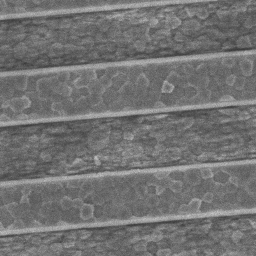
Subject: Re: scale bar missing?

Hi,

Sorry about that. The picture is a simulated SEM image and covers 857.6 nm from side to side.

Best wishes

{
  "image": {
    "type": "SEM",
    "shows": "one or a few lines or trenches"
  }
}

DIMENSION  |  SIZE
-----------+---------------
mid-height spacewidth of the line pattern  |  193 nanometres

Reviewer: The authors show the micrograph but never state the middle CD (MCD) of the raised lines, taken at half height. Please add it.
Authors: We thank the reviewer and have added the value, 50.8 pixels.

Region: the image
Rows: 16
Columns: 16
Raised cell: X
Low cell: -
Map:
XXXXXXX---------
----------------
----------------
------------XXXX
-XXXXXXXXXXXXXXX
XXXXXXXXXXXXXXXX
XXXXXXXXXXXXXXX-
XXXX------------
----------------
----------------
-----------XXXXX
XXXXXXXXXXXXXXXX
XXXXXXXXXXXXXXXX
XXXXXXXXXXXXX---
X---------------
----------------